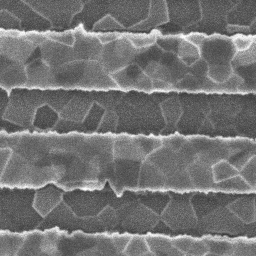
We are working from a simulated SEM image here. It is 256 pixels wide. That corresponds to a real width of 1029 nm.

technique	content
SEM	one or a few lines or trenches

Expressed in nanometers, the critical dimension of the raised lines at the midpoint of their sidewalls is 226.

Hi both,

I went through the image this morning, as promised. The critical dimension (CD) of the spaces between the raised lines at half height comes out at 178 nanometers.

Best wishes